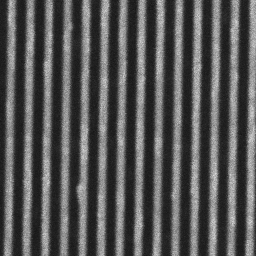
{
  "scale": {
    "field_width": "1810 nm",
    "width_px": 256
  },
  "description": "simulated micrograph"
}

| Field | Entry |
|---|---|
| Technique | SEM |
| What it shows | parallel lines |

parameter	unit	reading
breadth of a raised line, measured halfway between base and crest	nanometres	54.8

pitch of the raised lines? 131 nm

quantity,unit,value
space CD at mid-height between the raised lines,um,0.0786